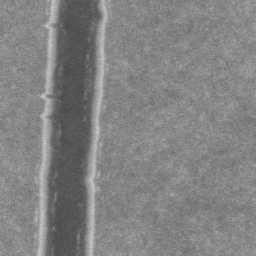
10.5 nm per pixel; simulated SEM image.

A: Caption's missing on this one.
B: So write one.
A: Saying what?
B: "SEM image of one or a few lines or trenches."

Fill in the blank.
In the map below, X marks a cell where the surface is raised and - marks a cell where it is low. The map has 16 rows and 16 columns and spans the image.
XXX---XXXXXXXXXX
XXX---XXXXXXXXXX
XXX---XXXXXXXXXX
XXX---XXXXXXXXXX
XXX---XXXXXXXXXX
XXX---XXXXXXXXXX
XXX---XXXXXXXXXX
XXX---XXXXXXXXXX
XXX---XXXXXXXXXX
XXX---XXXXXXXXXX
XXX---XXXXXXXXXX
XXX---XXXXXXXXXX
XXX---XXXXXXXXXX
XXX---XXXXXXXXXX
XXX---XXXXXXXXXX
XXX---XXXXXXXXXX